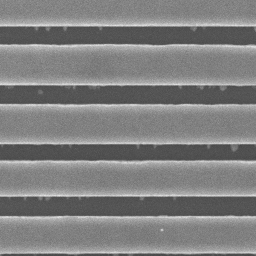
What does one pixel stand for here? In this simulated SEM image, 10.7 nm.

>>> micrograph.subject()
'lines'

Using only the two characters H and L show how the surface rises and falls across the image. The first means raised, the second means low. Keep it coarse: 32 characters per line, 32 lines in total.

HHHHHHHHHHHHHHHHHHHHHHHHHHHHHHHH
HHHHHHHHHHHHHHHHHHHHHHHHHHHHHHHH
HHHHHHHHHHHHHHHHHHHHHHHHHHHHHHHH
LLLLLLLLLLLLLLLLLLLLLLLLLLLLLLLL
LLLLLLLLLLLLLLLLLLLLLLLLLLLLLLLL
LLLLLLLLLLLLLLLLLLLLLLLLLLLLLLLL
HHHHHHHHHHHHHHHHHHHHHHHHHHHHHHHH
HHHHHHHHHHHHHHHHHHHHHHHHHHHHHHHH
HHHHHHHHHHHHHHHHHHHHHHHHHHHHHHHH
HHHHHHHHHHHHHHHHHHHHHHHHHHHHHHHH
HHHHHHHHHHHHHHHHHHHHHHHHHHHHHHHH
LLLLLLLLLLLLLLLLLLLLLLLLLLLLLLLL
LLLLLLLLLLLLLLLLLLLLLLLLLLLLLLLL
HHHHHHHHHHHHHHHHHHHHHHHHHHHHHHHH
HHHHHHHHHHHHHHHHHHHHHHHHHHHHHHHH
HHHHHHHHHHHHHHHHHHHHHHHHHHHHHHHH
HHHHHHHHHHHHHHHHHHHHHHHHHHHHHHHH
HHHHHHHHHHHHHHHHHHHHHHHHHHHHHHHH
LLLLLLLLLLLLLLLLLLLLLLLLLLLLLLLL
LLLLLLLLLLLLLLLLLLLLLLLLLLLLLLLL
HHHHHHHHHHHHHHHHHHHHHHHHHHHHHHHH
HHHHHHHHHHHHHHHHHHHHHHHHHHHHHHHH
HHHHHHHHHHHHHHHHHHHHHHHHHHHHHHHH
HHHHHHHHHHHHHHHHHHHHHHHHHHHHHHHH
HHHHHHHHHHHHHHHHHHHHHHHHHHHHHHHH
LLLLLLLLLLLLLLLLLLLLLLLLLLLLLLLL
LLLLLLLLLLLLLLLLLLLLLLLLLLLLLLLL
HHHHHHHHHHHHHHHHHHHHHHHHHHHHHHHH
HHHHHHHHHHHHHHHHHHHHHHHHHHHHHHHH
HHHHHHHHHHHHHHHHHHHHHHHHHHHHHHHH
HHHHHHHHHHHHHHHHHHHHHHHHHHHHHHHH
HHHHHHHHHHHHHHHHHHHHHHHHHHHHHHHH